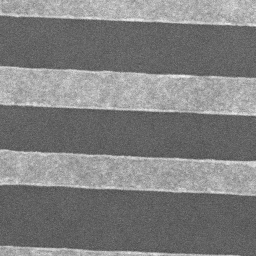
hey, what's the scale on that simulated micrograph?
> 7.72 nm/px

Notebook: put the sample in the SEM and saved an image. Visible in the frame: one or a few lines or trenches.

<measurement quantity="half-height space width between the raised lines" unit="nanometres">410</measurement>